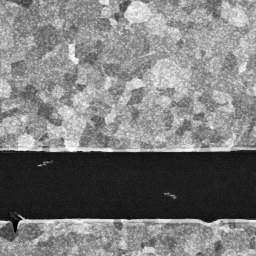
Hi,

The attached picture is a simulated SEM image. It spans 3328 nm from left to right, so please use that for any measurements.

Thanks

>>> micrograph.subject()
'one or a few lines or trenches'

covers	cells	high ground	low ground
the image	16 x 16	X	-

XXXXXXXXXXXXXXXX
XXXXXXXXXXXXXXXX
XXXXXXXXXXXXXXXX
XXXXXXXXXXXXXXXX
XXXXXXXXXXXXXXXX
XXXXXXXXXXXXXXXX
XXXXXXXXXXXXXXXX
XXXXXXXXXXXXXXXX
XXXXXXXXXXXXXXXX
----------------
----------------
----------------
----------------
----------------
XXXXXXXXXXXXXXXX
XXXXXXXXXXXXXXXX